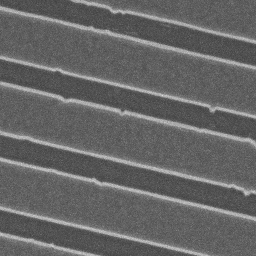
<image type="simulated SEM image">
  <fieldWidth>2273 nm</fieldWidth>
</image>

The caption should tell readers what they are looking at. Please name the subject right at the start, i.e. one or a few lines or trenches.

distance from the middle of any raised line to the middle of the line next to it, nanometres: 651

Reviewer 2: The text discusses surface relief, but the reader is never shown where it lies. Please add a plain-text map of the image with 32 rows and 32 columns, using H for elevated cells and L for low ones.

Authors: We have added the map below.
LLLLLLLLLLLHHHHHHHHHHHHHHHHHHHHH
HHLLLLLLLLLLLLHHHHHHHHHHHHHHHHHH
HHHHHHHLLLLLLLLLLLLLHHHHHHHHHHHH
HHHHHHHHHHHLLLLLLLLLLLLLLHHHHHHH
HHHHHHHHHHHHHHHLLLLLLLLLLLLLHHHH
HHHHHHHHHHHHHHHHHHHLLLLLLLLLLLLL
HHHHHHHHHHHHHHHHHHHHHHHLLLLLLLLL
LHHHHHHHHHHHHHHHHHHHHHHHHHHHLLLL
LLLLLLHHHHHHHHHHHHHHHHHHHHHHHHHH
LLLLLLLLLLHHHHHHHHHHHHHHHHHHHHHH
HLLLLLLLLLLLLLHHHHHHHHHHHHHHHHHH
HHHHHLLLLLLLLLLLLLHHHHHHHHHHHHHH
HHHHHHHHLLLLLLLLLLLLLLLHHHHHHHHH
HHHHHHHHHHHHHHLLLLLLLLLLLLHHHHHH
HHHHHHHHHHHHHHHHHHLLLLLLLLLLLLLH
HHHHHHHHHHHHHHHHHHHHHHLLLLLLLLLL
HHHHHHHHHHHHHHHHHHHHHHHHHHLLLLLL
LLLLHHHHHHHHHHHHHHHHHHHHHHHHHHHL
LLLLLLLLHHHHHHHHHHHHHHHHHHHHHHHH
LLLLLLLLLLLLHHHHHHHHHHHHHHHHHHHH
HHHLLLLLLLLLLLLLLHHHHHHHHHHHHHHH
HHHHHHHLLLLLLLLLLLLLLHHHHHHHHHHH
HHHHHHHHHHHLLLLLLLLLLLLLLHHHHHHH
HHHHHHHHHHHHHHHLLLLLLLLLLLLLLLHH
HHHHHHHHHHHHHHHHHHHHLLLLLLLLLLLL
HHHHHHHHHHHHHHHHHHHHHHHHLLLLLLLL
LLHHHHHHHHHHHHHHHHHHHHHHHHHHLLLL
LLLLLLHHHHHHHHHHHHHHHHHHHHHHHHHH
LLLLLLLLLLLHHHHHHHHHHHHHHHHHHHHH
HLLLLLLLLLLLLLLHHHHHHHHHHHHHHHHH
HHHHHHLLLLLLLLLLLLLHHHHHHHHHHHHH
HHHHHHHHHHLLLLLLLLLLLLLHHHHHHHHH